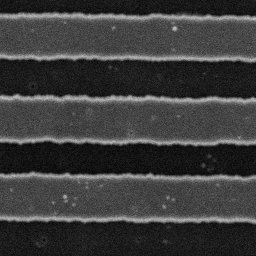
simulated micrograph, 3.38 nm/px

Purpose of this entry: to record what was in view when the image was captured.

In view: lines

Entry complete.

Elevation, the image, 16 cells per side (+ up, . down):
................
++++++++++++++++
++++++++++++++++
++++++++++++++++
................
................
++++++++++++++++
++++++++++++++++
++++++++++++++++
................
................
++++++++++++++++
++++++++++++++++
++++++++++++++++
................
................